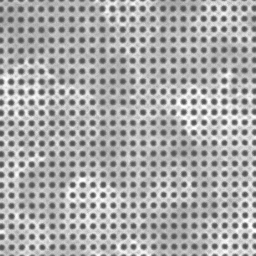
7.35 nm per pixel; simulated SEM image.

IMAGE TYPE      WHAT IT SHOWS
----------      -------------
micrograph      a regular array of holes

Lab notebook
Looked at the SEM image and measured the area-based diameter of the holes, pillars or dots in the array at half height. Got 0.0511 um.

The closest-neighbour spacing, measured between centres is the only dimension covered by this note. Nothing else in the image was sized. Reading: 9.93 px